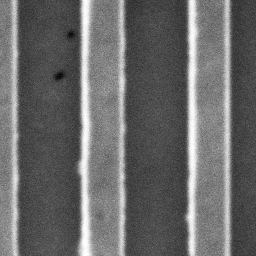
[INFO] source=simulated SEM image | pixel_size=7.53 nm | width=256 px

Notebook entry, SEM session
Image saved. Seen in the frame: lines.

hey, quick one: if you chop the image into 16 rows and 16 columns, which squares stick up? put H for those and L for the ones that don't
HLLLLHHHLLLLHHLL
HLLLLHHHLLLLHHLL
HLLLLHHHLLLLHHLL
HLLLLHHHLLLLHHLL
HLLLLHHHLLLLHHLL
HLLLLHHHLLLLHHLL
HLLLLHHHLLLLHHLL
HLLLLHHHLLLLHHLL
HLLLLHHHLLLLHHLL
HLLLLHHHLLLLHHLL
HLLLLHHHLLLLHHLL
HLLLLHHHLLLLHHLL
HLLLLHHHLLLLHHLL
HLLLLHHHLLLLHHLL
HLLLLHHHLLLLHHLL
HLLLLHHHLLLLHHLL